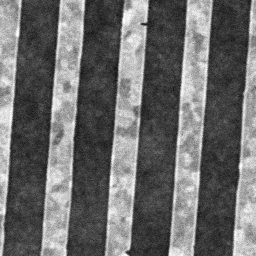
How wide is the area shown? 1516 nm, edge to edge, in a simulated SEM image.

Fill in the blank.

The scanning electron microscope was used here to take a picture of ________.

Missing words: one or a few lines or trenches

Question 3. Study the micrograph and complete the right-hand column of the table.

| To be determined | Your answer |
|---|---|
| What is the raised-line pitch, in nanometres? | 377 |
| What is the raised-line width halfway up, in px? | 23.7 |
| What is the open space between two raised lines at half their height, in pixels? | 40.2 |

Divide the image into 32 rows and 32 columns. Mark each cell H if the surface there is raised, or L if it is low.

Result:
HHHLLLLLHHLLLLLLHHLLLLLLHHLLLLLL
HHLLLLLLHHLLLLLLHHLLLLLHHHLLLLLH
HHLLLLLLHHLLLLLHHHLLLLLHHHLLLLLH
HHLLLLLHHHLLLLLHHHLLLLLHHHLLLLLH
HHLLLLLHHHLLLLLHHHLLLLLHHHLLLLLH
HHLLLLLHHHLLLLLHHHLLLLLHHHLLLLLH
HHLLLLLHHHLLLLLHHHLLLLLHHHLLLLLH
HHLLLLLHHHLLLLLHHHLLLLLHHHLLLLLH
HHLLLLLHHHLLLLLHHHLLLLLHHHLLLLLH
HHLLLLLHHHLLLLLHHHLLLLLHHHLLLLLH
HHLLLLLHHHLLLLLHHHLLLLLHHHLLLLLH
HHLLLLLHHHLLLLLHHHLLLLLHHHLLLLLH
HHLLLLLHHHLLLLLHHHLLLLLHHHLLLLLH
HLLLLLLHHLLLLLLHHLLLLLLHHLLLLLHH
HLLLLLHHHLLLLLHHHLLLLLHHHLLLLLHH
HLLLLLHHHLLLLLHHHLLLLLHHHLLLLLHH
HLLLLLHHHLLLLLHHHLLLLLHHHLLLLLHH
HLLLLLHHHLLLLLHHHLLLLLHHHLLLLLHH
HLLLLLHHHLLLLLHHHLLLLLHHHLLLLLHH
HLLLLLHHHLLLLLHHHLLLLLHHHLLLLLHH
HLLLLLHHHLLLLLHHHLLLLLHHHLLLLLHH
HLLLLLHHHLLLLLHHHLLLLLHHHLLLLLHH
HLLLLLHHHLLLLLHHHLLLLLHHHLLLLLHH
HLLLLLHHHLLLLLHHHLLLLLHHHLLLLLHH
HLLLLLHHHLLLLLHHHLLLLLHHHLLLLLHH
HLLLLLHHHLLLLLHHHLLLLLHHHLLLLLHH
HLLLLLHHHLLLLLHHHLLLLLHHLLLLLLHH
LLLLLLHHHLLLLLHHLLLLLLHHLLLLLLHH
LLLLLHHHLLLLLLHHLLLLLLHHLLLLLHHH
LLLLLHHHLLLLLHHHLLLLLHHHLLLLLHHH
LLLLLHHHLLLLLHHHLLLLLHHHLLLLLHHH
LLLLLHHHLLLLLHHHLLLLLHHHLLLLLHHH